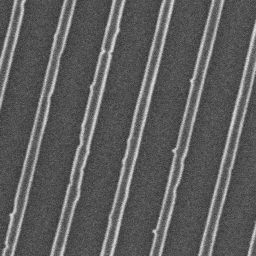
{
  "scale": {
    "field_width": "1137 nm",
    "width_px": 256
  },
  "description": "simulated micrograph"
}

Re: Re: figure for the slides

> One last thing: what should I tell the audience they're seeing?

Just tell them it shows parallel lines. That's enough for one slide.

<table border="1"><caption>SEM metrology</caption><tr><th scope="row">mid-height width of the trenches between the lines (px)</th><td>37.4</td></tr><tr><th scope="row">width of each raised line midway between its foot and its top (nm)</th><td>46.9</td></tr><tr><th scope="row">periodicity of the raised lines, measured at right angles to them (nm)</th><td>213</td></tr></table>